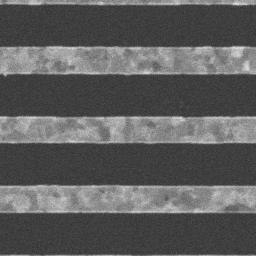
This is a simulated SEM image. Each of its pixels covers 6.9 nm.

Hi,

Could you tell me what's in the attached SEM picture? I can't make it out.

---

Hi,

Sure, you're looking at one or a few lines or trenches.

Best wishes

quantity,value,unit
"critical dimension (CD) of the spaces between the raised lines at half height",0.298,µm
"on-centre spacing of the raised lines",480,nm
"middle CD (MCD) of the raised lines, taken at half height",180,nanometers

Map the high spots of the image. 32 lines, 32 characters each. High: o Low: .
................................
................................
................................
................................
................................
................................
oooooooooooooooooooooooooooooooo
oooooooooooooooooooooooooooooooo
oooooooooooooooooooooooooooooooo
................................
................................
................................
................................
................................
................................
oooooooooooooooooooooooooooooooo
oooooooooooooooooooooooooooooooo
oooooooooooooooooooooooooooooooo
................................
................................
................................
................................
................................
oooooooooooooooooooooooooooooooo
oooooooooooooooooooooooooooooooo
oooooooooooooooooooooooooooooooo
....................oo..........
................................
................................
................................
................................
................................